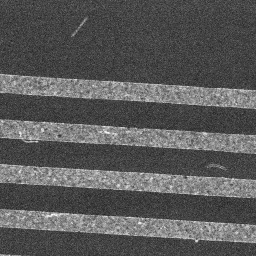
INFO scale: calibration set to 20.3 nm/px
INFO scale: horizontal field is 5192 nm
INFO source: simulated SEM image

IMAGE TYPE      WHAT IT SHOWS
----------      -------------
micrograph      parallel lines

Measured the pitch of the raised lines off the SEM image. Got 909 nanometres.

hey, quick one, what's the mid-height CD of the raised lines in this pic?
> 17.5 px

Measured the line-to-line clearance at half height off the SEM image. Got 554 nm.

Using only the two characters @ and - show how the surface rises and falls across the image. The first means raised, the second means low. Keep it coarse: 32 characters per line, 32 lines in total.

--------------------------------
--------------------------------
--------------------------------
--------------------------------
--------------------------------
--------------------------------
--------------------------------
--------------------------------
--------------------------------
@@------------------------------
@@@@@@@@@@@@@@@@@@@-------------
@@@@@@@@@@@@@@@@@@@@@@@@@@@@@@@@
----------------@@@@@@@@@@@@@@@@
-------------------------------@
--------------------------------
@@@@@@@@@-----------------------
@@@@@@@@@@@@@@@@@@@@@@@@--------
----@-@@@@@@@@@@@@@@@@@@@@@@@@@@
----------------------@@@@@@@@@@
--------------------------------
--------------------------------
@@@@@@@@@@@@@@@-----------------
@@@@@@@@@@@@@@@@@@@@@@@@@@@@@@@-
------------@@@@@@@@@@@@@@@@@@@@
----------------------------@@@@
--------------------------------
@@@@@---------------------------
@@@@@@@@@@@@@@@@@@@@@-----------
---@@@@@@@@@@@@@@@@@@@@@@@@@@@@@
------------------@@@@@@@@@@@@@@
--------------------------------
--------------------------------